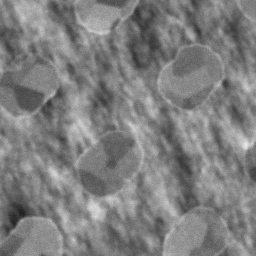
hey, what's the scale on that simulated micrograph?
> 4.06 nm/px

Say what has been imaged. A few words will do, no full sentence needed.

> raised bodies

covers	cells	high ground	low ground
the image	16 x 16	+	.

.....+++.......+
.....++.........
................
.+.........+++..
++++......++++..
+++.......+++...
+++........++...
................
......++........
.....++++......+
.....++++......+
.....+++........
................
............++..
.+++.......+++..
++++......++++..